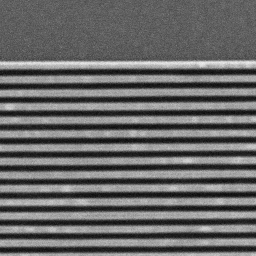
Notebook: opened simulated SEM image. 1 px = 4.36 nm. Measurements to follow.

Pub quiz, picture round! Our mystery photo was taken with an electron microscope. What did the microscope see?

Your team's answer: parallel lines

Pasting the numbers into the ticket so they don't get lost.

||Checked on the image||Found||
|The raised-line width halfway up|28.3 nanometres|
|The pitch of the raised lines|59.5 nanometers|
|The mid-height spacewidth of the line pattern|32.2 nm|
